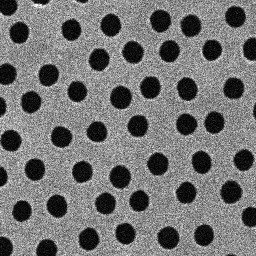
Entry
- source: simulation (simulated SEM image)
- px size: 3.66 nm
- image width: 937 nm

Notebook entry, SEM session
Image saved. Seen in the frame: a regular array of holes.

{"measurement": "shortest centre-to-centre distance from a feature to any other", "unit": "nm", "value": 126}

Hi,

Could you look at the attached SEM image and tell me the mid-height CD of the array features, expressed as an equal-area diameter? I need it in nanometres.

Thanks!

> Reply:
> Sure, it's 77.7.